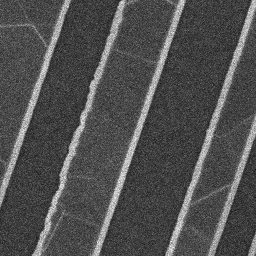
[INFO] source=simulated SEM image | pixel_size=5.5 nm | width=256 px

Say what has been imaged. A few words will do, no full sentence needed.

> one or a few lines or trenches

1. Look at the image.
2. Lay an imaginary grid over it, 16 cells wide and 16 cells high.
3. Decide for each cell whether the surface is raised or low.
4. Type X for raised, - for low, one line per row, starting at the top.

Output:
XXXX----XXX-----
XXXX---XXXX----X
XXX----XXXX----X
XXX----XXX-----X
XXX---XXXX----XX
XX----XXXX----XX
XX----XXX-----XX
XX---XXXX----XXX
X----XXX-----XXX
X---XXXX-----XX-
X---XXXX----XXX-
----XXX-----XXX-
---XXXX-----XX--
---XXXX----XXX--
---XXX-----XXX--
--XXXX-----XX---